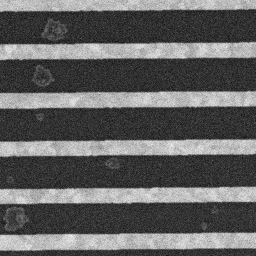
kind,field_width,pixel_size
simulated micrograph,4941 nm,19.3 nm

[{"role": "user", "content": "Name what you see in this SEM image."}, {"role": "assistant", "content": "lines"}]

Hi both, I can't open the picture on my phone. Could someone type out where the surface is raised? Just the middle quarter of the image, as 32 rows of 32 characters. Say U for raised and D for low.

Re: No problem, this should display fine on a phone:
DDDDDDDDDDDDDDDDDDDDDDDDDDDDDDDD
DDDDDDDDDDDDDDDDDDDDDDDDDDDDDDDD
DDDDDDDDDDDDDDDDDDDDDDDDDDDDDDDD
DDDDDDDDDDDDDDDDDDDDDDDDDDDDDDDD
DDDDDDDDDDDDDDDDDDDDDDDDDDDDDDDD
DDDDDDDDDDDDDDDDDDDDDDDDDDDDDDDD
DDDDDDDDDDDDDDDDDDDDDDDDDDDDDDDD
UUUUUUUUUUUUUUUUUUUUUUUUUUUUUUUU
UUUUUUUUUUUUUUUUUUUUUUUUUUUUUUUU
UUUUUUUUUUUUUUUUUUUUUUUUUUUUUUUU
UUUUUUUUUUUUUUUUUUUUUUUUUUUUUDDD
DDDDDDDDDDDDDDDDDDDDDDDDDDDDDDDD
DDDDDDDDDDDDDDDDDDDDDDDDDDDDDDDD
DDDDDDDDDDDDDDDDDDDDDDDDDDDDDDDD
DDDDDDDDDDDDDDDDDDDDDDDDDDDDDDDD
DDDDDDDDDDDDDDDDDDDDDDDDDDDDDDDD
DDDDDDDDDDDDDDDDDDDDDDDDDDDDDDDD
DDDDDDDDDDDDDDDDDDDDDDDDDDDDDDDD
DDDDDDDDDDDDDDDDDDDDDDDDDDDDDDDD
UUUUUUUUUUUUUUUUUUUUUUUUUUUUUUUU
UUUUUUUUUUUUUUUUUUUUUUUUUUUUUUUU
UUUUUUUUUUUUUUUUUUUUUUUUUUUUUUUU
UUUUUUUUUUUUUUUUUUUUUUDUUUUUDDDD
DDDDDDDDDDDDDDDDDDDDDDDDDDDDDDDD
DDDDDDDDDDDUUDDDDDDDDDDDDDDDDDDD
DDDDDDDDDDDDUDDDDDDDDDDDDDDDDDDD
DDDDDDDDDDDDDDDDDDDDDDDDDDDDDDDD
DDDDDDDDDDDDDDDDDDDDDDDDDDDDDDDD
DDDDDDDDDDDDDDDDDDDDDDDDDDDDDDDD
DDDDDDDDDDDDDDDDDDDDDDDDDDDDDDDD
DDDDDDDDDDDDDDDDDDDDDDDDDDDDDDDD
UUUUUUUUUUUUUUUUUUUUUUUUUUUUUUUU